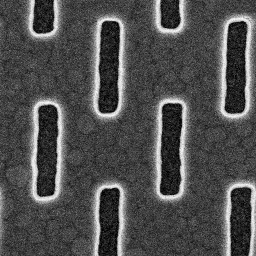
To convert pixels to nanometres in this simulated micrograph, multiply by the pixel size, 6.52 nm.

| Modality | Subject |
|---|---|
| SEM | holes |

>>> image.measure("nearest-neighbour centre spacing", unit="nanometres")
672